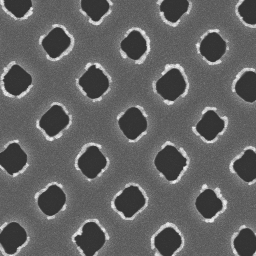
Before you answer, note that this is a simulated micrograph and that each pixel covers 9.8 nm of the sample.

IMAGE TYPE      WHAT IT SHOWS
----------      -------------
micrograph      a regular array of holes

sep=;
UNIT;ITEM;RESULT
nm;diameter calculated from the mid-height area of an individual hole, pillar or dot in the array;274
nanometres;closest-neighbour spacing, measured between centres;534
